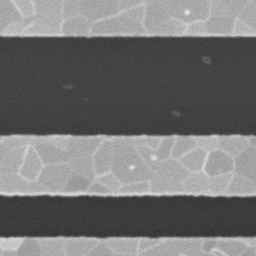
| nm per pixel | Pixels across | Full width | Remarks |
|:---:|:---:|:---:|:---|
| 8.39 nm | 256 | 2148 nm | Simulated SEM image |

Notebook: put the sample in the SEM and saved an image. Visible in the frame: lines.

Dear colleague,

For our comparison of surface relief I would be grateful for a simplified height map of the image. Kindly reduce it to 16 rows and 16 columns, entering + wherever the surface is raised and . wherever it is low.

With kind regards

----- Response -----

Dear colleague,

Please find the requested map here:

++++++++++++++++
++++++++++++++++
................
................
................
................
................
................
+++++.+.++++.+++
++++++++++++++++
++++++++++++++++
++++++++++++++++
................
................
................
++++++++++++++++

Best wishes